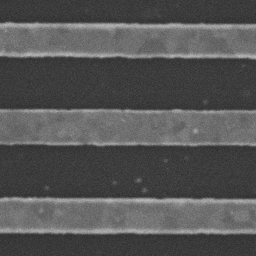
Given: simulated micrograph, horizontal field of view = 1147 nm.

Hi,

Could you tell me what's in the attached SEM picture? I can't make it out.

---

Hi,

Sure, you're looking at lines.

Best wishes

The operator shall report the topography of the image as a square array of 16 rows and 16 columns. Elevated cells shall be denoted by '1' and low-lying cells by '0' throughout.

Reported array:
0000000000000000
1111010000000000
1111111111111111
0100011111111111
0000000000000000
0000000000000000
0000000000000000
1111111111111111
1111111111111111
0000000000000000
0000000000000000
0000000000000000
1111111111111111
1111111111111111
1111111111111111
0000000000000000